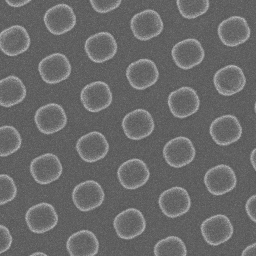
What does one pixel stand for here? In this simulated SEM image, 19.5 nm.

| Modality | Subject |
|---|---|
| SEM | a regular array of raised bodies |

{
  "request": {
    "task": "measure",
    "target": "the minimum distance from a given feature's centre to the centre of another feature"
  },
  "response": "966 nm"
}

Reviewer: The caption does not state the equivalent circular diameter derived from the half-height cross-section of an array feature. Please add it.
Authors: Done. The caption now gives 572 nm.